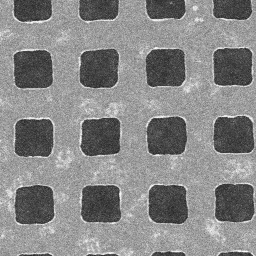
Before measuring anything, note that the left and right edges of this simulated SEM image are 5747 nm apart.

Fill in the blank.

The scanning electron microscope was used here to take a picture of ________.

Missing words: a regular array of holes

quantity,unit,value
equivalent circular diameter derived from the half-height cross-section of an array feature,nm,955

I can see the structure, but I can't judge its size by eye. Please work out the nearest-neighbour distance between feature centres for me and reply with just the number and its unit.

1490 nanometers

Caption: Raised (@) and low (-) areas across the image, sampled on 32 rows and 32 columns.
@@----@@@@-----@@@-----@@@@----@
@@----@@@@-----@@@-----@@@@----@
@@----@@@@----@@@@@@@@@@@@@@@@@@
@@@@@@@@@@@@@@@@@@@@@@@@@@@@@@@@
@@@@@@@@@@@@@@@@@@@@@@@@@@@@@@@@
@@@@@@@@@@@@@@@@@@@@@@@@@@@@@@@@
@@----@@@@@----@@@@----@@@@----@
@@----@@@@-----@@@-----@@@@----@
@@-----@@@-----@@@-----@@@@-----
@@-----@@@-----@@@-----@@@@-----
@@----@@@@----@@@@@----@@@@----@
@@@@@@@@@@@@@@@@@@@@@@@@@@@@@@@@
@@@@@@@@@@@@@@@@@@@@@@@@@@@@@@@@
@@@@@@@@@@@@@@@@@@@@@@@@@@@@@@@@
@@@@@@@@@@@@@@@@@@@@@@@@@@@@@@@@
@@-----@@@-----@@@@----@@@@-----
@@-----@@@-----@@@-----@@@@-----
@@-----@@@-----@@@-----@@@@-----
@@-----@@@-----@@@-----@@@@-----
@@@---@@@@@-@@@@@@@@@@@@@@@@@@@@
@@@@@@@@@@@@@@@@@@@@@@@@@@@@@@@@
@@@@@@@@@@@@@@@@@@@@@@@@@@@@@@@@
@@@@@@@@@@@@@@@@@@@@@@@@@@@@@@@@
@@----@@@@@----@@@@----@@@@-----
@@-----@@@-----@@@@----@@@@-----
@@-----@@@-----@@@@----@@@@-----
@@-----@@@-----@@@@-----@@@-----
@@----@@@@-----@@@@----@@@@----@
@@@@@@@@@@@@@@@@@@@@@@@@@@@@@@@@
@@@@@@@@@@@@@@@@@@@@@@@@@@@@@@@@
@@@@@@@@@@@@@@@@@@@@@@@@@@@@@@@@
@@@@@@@@@@@@@@@@@@@----@@@@@@--@